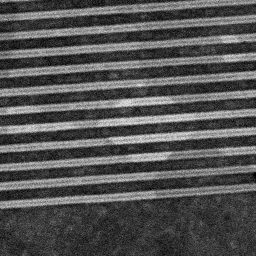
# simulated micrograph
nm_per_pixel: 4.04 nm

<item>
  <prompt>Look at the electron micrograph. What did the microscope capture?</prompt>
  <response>parallel lines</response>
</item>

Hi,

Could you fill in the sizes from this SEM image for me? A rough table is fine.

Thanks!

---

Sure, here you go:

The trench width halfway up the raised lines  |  52.3 nm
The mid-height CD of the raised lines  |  0.0236 µm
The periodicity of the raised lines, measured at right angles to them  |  75.4 nm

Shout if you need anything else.